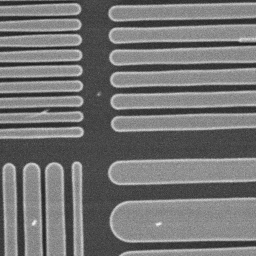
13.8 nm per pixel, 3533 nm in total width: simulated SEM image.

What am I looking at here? groups of lines, slits or small figures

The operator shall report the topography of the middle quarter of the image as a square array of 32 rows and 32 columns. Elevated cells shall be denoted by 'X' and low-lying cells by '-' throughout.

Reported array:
--------------------------------
XXXX----------------------------
XXXX--------XXXXXXXXXXXXXXXXXXXX
------------XXXXXXXXXXXXXXXXXXXX
XXXX--------XXXXXXXXXXXXXXXXXXXX
XXXX--------XXXXXXXXX-----------
XXXX----------------------------
-------------------XXXXXXXXXXXXX
XXXX--------XXXXXXXXXXXXXXXXXXXX
XXXXX-------XXXXXXXXXXXXXXXXXXXX
XXXX--------XXXXXXXXXXXXXXXXXXXX
--------------------------------
XXXXX---------------------------
XXXXX--------XXXXXXXXXXXXXXXXXXX
------------XXXXXXXXXXXXXXXXXXXX
------------XXXXXXXXXXXXXXXXXXXX
XXXXX--------XXXXXXX------------
XXXXX---------------------------
--------------------------------
--------------------------------
--------------------------------
--------------------------------
--------------------------------
--------------------------------
-------------XXXXXXXXXXXXXXXXXXX
--XX--------XXXXXXXXXXXXXXXXXXXX
--XX-------XXXXXXXXXXXXXXXXXXXXX
--XX-------XXXXXXXXXXXXXXXXXXXXX
--XX-------XXXXXXXXXXXXXXXXXXXXX
--XX--------XXXXXXXXXXXXXXXXXXXX
--XX----------------------------
--XX----------------------------